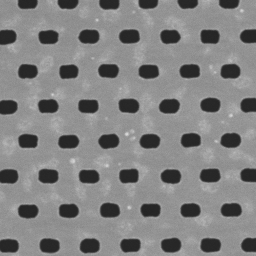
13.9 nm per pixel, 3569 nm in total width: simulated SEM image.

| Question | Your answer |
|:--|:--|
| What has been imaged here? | a regular array of holes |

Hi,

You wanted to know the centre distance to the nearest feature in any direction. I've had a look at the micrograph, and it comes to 552 nanometres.